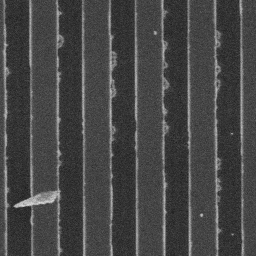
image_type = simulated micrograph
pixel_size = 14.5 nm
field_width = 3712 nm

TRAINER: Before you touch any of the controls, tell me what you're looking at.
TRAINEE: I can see lines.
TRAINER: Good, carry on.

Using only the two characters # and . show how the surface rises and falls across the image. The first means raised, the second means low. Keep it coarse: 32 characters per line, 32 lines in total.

#...###...####...###....###...##
#...###...####...###....###...##
#...###...####...###....###...##
#...###...####...###....###...##
#...###...####...###....###...##
#...###...####...###....###...##
#...###...####...###....###...##
#...###...####...###....###...##
#...###...####...###....###...##
#...###...####...###....###...##
#...###...####...###....###...##
#...###...####...###....###...##
#...###...####...###....###...##
#...###...####...###....###...##
#...###...####...###....###...##
#...###...####...###....###...##
#...###...####...###....###...##
#...###...####...###....###...##
#...###...####...###....###...##
#...###...####...###....###...##
#...###...####...###....###...##
#...###...####...###....###...##
#...###...####...####...###...##
#...###...####...####...###...##
#...###...####...####...###...##
#.#####...####...####...###...##
#...###...####...####...###...##
#...###...####...####...###...##
#...###...####...####...###...##
#...###...####...####...###...##
#...###...####...####...###...##
#...###...####...####...###...##